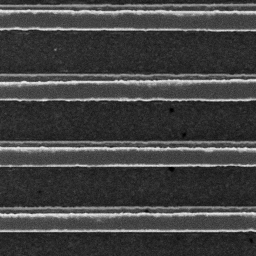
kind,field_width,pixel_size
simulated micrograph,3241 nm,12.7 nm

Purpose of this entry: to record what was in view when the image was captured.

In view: lines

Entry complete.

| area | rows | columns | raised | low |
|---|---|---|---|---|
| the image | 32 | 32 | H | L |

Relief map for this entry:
LLLLLLLLLLLLLLLLLLLLLLLLLLLLLLLL
HHHHHHHHHHHHHHHHHHHHHHHHHHHHHHHH
HHHHHHHHHHHHHHHHHHHHHHHHHHHHHHHH
HHHHHHHHHHHHHHHHHHHHHHHHHHHHHHHH
LLLLLLLLLLLLLLLLLLLLLLLLLLLLLLLL
LLLLLLLLLLLLLLLLLLLLLLLLLLLLLLLL
LLLLLLLLLLLLLLLLLLLLLLLLLLLLLLLL
LLLLLLLLLLLLLLLLLLLLLLLLLLLLLLLL
LLLLLLLLLLLLLLLLLLLLLLLLLLLLLLLL
HHHHHHHHHHHHHHHHHHLHHHHHHHHHHHHH
HHHHHHHHHHHHHHHHHHHHHHHHHHHHHHHH
HHHHHHHHHHHHHHHHHHHHHHHHHHHHHHHH
LLHLHHLLHLHLLLHHHHHLHHHHHHHHHHHH
LLLLLLLLLLLLLLLLLLLLLLLLLLLLLLLL
LLLLLLLLLLLLLLLLLLLLLLLLLLLLLLLL
LLLLLLLLLLLLLLLLLLLLLLLLLLLLLLLL
LLLLLLLLLLLLLLLLLLLLLLLLLLLLLLLL
LLLLLLLLLLLLLLLLLLLLLLLLLLLLLLLL
HHHHHHHHHHHHHHHHHHHHHHHHHHHHHHHH
HHHHHHHHHHHHHHHHHHHHHHHHHHHHHHHH
HHHHHHHHHHHHHHHHHHHHHHHHHHHHHHHH
LLLLLLLLLLLLLLLLLLLLLLLLLLLLLLLL
LLLLLLLLLLLLLLLLLLLLLLLLLLLLLLLL
LLLLLLLLLLLLLLLLLLLLLLLLLLLLLLLL
LLLLLLLLLLLLLLLLLLLLLLLLLLLLLLLL
LLLLLLLLLLLLLLLLLLLLLLLLLLLLLLLL
HHHHHHHHHHHHHHHHHHHHHHHHHHHHHHHH
HHHHHHHHHHHHHHHHHHHHHHHHHHHHHHHH
HHHHHHHHHHHHHHHHHHHHHHHHHHHHHHHH
LLLLLLLLLLLLLLLLLLLLLLLLLLLLLLLL
LLLLLLLLLLLLLLLLLLLLLLLLLLLLLLLL
LLLLLLLLLLLLLLLLLLLLLLLLLLLLLLLL